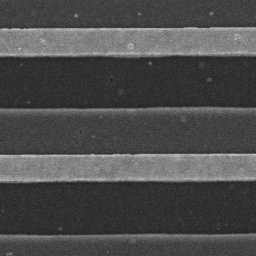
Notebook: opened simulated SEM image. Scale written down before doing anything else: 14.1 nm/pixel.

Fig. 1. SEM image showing lines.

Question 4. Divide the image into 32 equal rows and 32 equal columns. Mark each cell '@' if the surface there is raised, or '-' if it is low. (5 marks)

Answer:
@@@@@@@@@@@@@@@@@@@@@@@@@@@@@@@@
@@@@@@@@@@@@@@@@@@@@@@@@@@@@@@@@
@@@@@@@@@@@@@@@@@@@@@@@@@@@@@@@@
@@@@@@@@@@@@@@@@@@@@@@@@@@@@@@@@
@@@@@@@@@@@@@@@@@@@@@@@@@@@@@@@@
@@@@@@@@@@@@@@@@@@@@@@@@@@@@@@@@
@@@@@@@@@@@@@@@@@@@@@@@@@@@@@@@@
--------------------------------
--------------------------------
--------------------------------
--------------------------------
--------------------------------
--------------------------------
--------------------------------
@@@@@@@@@@@@@@@@@@@@@@@@@@@@@@@@
@@@@@@@@@@@@@@@@@@@@@@@@@@@@@@@@
@@@@@@@@@@@@@@@@@@@@@@@@@@@@@@@@
@@@@@@@@@@@@@@@@@@@@@@@@@@@@@@@@
@@@@@@@@@@@@@@@@@@@@@@@@@@@@@@@@
@@@@@@@@@@@@@@@@@@@@@@@@@@@@@@@@
@@@@@@@@@@@@@@@@@@@@@@@@@@@@@@@@
@@@@@@@@@@@@@@@@@@@@@@@@@@@@@@@@
@@@@@@@@@@-@@@@-----------------
--------------------------------
--------------------------------
--------------------------------
--------------------------------
--------------------------------
--------------------------------
--------------------------@@@@@@
@@@@@@@@@@@@@@@@@@@@@@@@@@@@@@@@
@@@@@@@@@@@@@@@@@@@@@@@@@@@@@@@@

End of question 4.